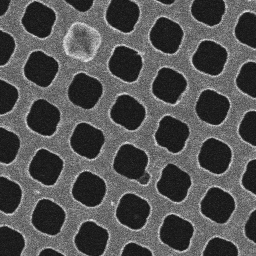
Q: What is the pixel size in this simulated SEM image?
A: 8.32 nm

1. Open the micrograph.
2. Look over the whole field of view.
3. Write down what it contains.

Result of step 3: a regular array of holes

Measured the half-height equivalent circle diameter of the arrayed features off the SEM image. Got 285 nm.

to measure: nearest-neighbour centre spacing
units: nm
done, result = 404